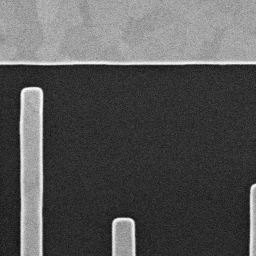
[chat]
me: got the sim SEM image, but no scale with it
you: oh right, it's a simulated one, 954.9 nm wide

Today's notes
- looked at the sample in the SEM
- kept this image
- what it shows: wiring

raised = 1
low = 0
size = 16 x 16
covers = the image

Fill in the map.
1111111111111111
1111111111111111
1111111111111111
1111111111111111
0000000000000000
0000000000000000
0110000000000000
0110000000000000
0110000000000000
0110000000000000
0110000000000000
0110000000000000
0110000000000000
0110000000000000
0110000100000000
0110000100000000